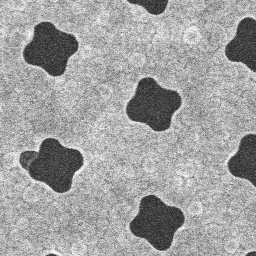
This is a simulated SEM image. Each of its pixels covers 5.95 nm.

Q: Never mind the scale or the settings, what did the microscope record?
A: holes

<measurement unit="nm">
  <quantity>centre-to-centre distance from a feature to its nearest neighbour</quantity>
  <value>692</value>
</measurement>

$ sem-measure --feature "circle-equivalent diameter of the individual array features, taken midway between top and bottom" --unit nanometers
296